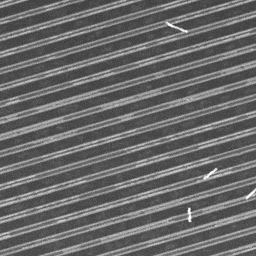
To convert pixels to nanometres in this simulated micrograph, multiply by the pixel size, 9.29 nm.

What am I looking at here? parallel lines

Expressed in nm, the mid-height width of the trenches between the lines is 102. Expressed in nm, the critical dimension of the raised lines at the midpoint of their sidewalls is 45.7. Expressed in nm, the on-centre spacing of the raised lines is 148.